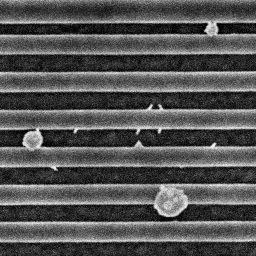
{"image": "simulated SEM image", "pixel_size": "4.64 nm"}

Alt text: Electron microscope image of parallel lines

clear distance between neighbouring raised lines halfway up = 82.9 nm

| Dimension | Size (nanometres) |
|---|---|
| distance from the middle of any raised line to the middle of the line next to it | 174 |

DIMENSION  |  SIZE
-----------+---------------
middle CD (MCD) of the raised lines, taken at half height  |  0.0911 micrometres